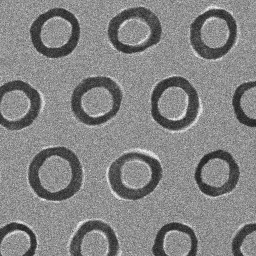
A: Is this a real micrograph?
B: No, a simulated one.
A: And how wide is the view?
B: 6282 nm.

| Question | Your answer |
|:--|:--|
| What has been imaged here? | a regular array of ring-shaped grooves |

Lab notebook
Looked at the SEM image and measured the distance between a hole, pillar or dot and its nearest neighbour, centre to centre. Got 1.91 um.